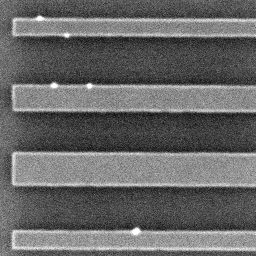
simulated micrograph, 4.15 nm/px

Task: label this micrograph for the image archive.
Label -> groups of lines, slits or small figures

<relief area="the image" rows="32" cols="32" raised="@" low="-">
--------------------------------
--------------------------------
--@@@@@@@@@@@@@@@@@@@@@@@@@@@@@@
--@@@@@@@@@@@@@@@@@@@@@@@@@@@@@@
--------------------------------
--------------------------------
--------------------------------
--------------------------------
--------------------------------
--------------------------------
--------------------------------
--@@@@@@@@@@@@@@@@@@@@@@@@@@@@@@
--@@@@@@@@@@@@@@@@@@@@@@@@@@@@@@
--@@@@@@@@@@@@@@@@@@@@@@@@@@@@@@
--------------------------------
--------------------------------
--------------------------------
--------------------------------
--------------------------------
--@@@@@@@@@@@@@@@@@@@@@@@@@@@@@@
--@@@@@@@@@@@@@@@@@@@@@@@@@@@@@@
--@@@@@@@@@@@@@@@@@@@@@@@@@@@@@@
--@@@@@@@@@@@@@@@@@@@@@@@@@@@@@@
--------------------------------
--------------------------------
--------------------------------
--------------------------------
--------------------------------
--------------------------------
--@@@@@@@@@@@@@@@@@@@@@@@@@@@@@@
--@@@@@@@@@@@@@@@@@@@@@@@@@@@@@@
--------------------------------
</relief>